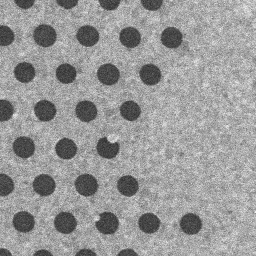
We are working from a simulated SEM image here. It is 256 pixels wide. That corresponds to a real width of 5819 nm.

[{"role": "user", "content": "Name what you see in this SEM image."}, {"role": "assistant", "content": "a regular array of holes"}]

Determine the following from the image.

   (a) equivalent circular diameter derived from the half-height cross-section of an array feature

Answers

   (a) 22.1 px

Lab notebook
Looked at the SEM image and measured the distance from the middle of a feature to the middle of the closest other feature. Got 945 nm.